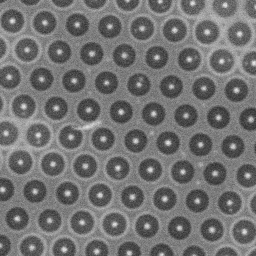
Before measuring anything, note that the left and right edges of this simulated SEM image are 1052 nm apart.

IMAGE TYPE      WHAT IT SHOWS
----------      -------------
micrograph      an array of small figures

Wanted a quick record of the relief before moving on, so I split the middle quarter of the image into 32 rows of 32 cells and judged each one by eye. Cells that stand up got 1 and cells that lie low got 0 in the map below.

11111111111110000111100001111000
10001111111111111111111111111100
00000111100011111100111111111111
00000111000001110000011110000111
00000011001000110000001100000011
00000111000000110000001100000011
10000111000001110000001100000011
11111111110111111000011100000111
11111101111111111111111111001111
01110000111110001111110111111111
01100000011100000111000001111000
01100000011000000110000001110000
01100000011000000110001001100000
11110000011100000111000001110000
11111001111110001111000001110000
00011111111111111111110111111000
00001111000011111001111111111111
00000110000001100000111100001111
01000110000001100000011000000111
00000110000001100000011000000110
00001110000011100000011000000110
10111111000111110000111100001110
11111011111111111111111110011111
11100000111100011111100111111111
11000000111000001110000011110000
11000100010000001110000011100000
11000000110000000100010001000000
11100000111000001110000001100000
11110011111000001110000011100000
00111111111111111111001111110001
00011110000111110011111111111111
00001100000011100000111000011111